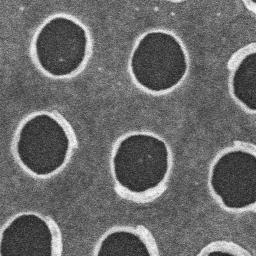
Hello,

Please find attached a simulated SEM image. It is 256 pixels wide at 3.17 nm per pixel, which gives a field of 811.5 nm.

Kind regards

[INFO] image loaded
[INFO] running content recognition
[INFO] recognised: holes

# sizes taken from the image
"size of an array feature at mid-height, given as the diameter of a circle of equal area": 183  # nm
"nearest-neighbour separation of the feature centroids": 0.315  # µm